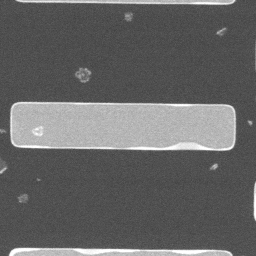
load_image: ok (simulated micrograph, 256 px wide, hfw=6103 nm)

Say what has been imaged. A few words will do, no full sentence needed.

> groups of lines, slits or small figures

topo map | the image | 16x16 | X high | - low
----------------
----------------
----------------
----------------
----------------
----------------
-XXXXXXXXX------
-XXXXXXXXXXXXXX-
-XXXXXXXXXXXXXX-
----------------
----------------
----------------
----------------
----------------
----------------
----------------